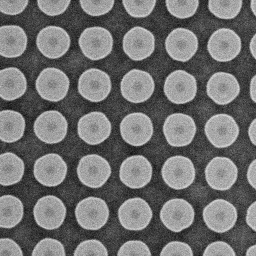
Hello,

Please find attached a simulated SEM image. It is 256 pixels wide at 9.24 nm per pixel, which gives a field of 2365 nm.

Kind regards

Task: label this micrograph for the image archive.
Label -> an array of small figures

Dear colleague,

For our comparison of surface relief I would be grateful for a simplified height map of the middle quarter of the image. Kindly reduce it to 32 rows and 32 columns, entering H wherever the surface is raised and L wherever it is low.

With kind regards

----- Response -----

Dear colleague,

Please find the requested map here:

LLLLLLLLLLLLLLLLLLLLLLLLLLLLLLLL
LLLLLLHHHLLLLLLLLLLLLLLLLLLLLLLL
LLLLLHHHHHHLLLLLHHHHHLLLLLLHHHHL
HLLLHHHHHHHLLLLHHHHHHHLLLLHHHHHH
HLLLHHHHHHHLLLHHHHHHHHLLLHHHHHHH
HLLLHHHHHHHHLLHHHHHHHHLLLHHHHHHH
HLLLHHHHHHHLLLHHHHHHHHLLLHHHHHHH
LLLLHHHHHHHLLLLHHHHHHHLLLHHHHHHH
LLLLLHHHHHLLLLLHHHHHHLLLLLHHHHHH
LLLLLLLLLLLLLLLLLHHLLLLLLLLHHHHL
LLLLLLLLLLLLLLLLLLLLLLLLLLLLLLLL
LLLLLLLLLLLLLLLLLLLLLLLLLLLLLLLL
LLLLLLHHHHLLLLLLLHHHLLLLLLLLLLLL
LLLLHHHHHHHLLLLHHHHHHLLLLLHHHHHH
HLLLHHHHHHHLLLHHHHHHHHLLLHHHHHHH
HLLLHHHHHHHHLLHHHHHHHHLLLHHHHHHH
HLLLHHHHHHHHLLHHHHHHHHLLLHHHHHHH
LLLLHHHHHHHLLLHHHHHHHHLLLHHHHHHH
LLLLHHHHHHHLLLLHHHHHHLLLLLHHHHHH
LLLLLLHHHLLLLLLLHHHHHLLLLLHHHHHH
LLLLLLLLLLLLLLLLLLLLLLLLLLLLLLLL
LLLLLLLLLLLLLLLLLLLLLLLLLLLLLLLL
LLLLLLLLLLLLLLLLLLLLLLLLLLLLLLLL
LLLLLHHHHHLLLLLLHHHHLLLLLLLHHHLL
LLLLHHHHHHHLLLLHHHHHHLLLLHHHHHHH
HLLLHHHHHHHLLLHHHHHHHHLLLHHHHHHH
HLLHHHHHHHHHLLHHHHHHHHLLLHHHHHHH
LLLHHHHHHHHHLLHHHHHHHHLLLHHHHHHH
LLLLHHHHHHHLLLHHHHHHHHLLLHHHHHHH
LLLLLHHHHHLLLLLHHHHHHLLLLHHHHHHH
LLLLLLHHHLLLLLLLHHHHLLLLLLHHHHHL
LLLLLLLLLLLLLLLLLLLLLLLLLLLLLLLL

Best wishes